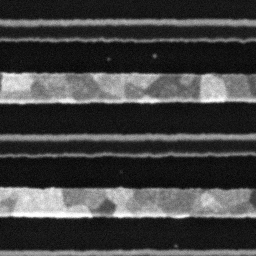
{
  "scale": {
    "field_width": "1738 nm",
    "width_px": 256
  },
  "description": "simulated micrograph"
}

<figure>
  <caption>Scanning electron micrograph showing lines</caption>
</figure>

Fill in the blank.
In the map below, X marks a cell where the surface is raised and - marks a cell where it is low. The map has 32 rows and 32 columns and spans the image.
--------------------------------
--------------------------------
--------------------------------
XXXXXXXXXXXXXXXXXXXXXXXXXXXXXXXX
XXXXXXXXXXXXXXXXXXXXXXXXXXXXXXXX
--------------------------------
--------------------------------
--------------------------------
--------------------------------
XXXXXXXXXXXXXXXXXXXXXXXXXXXXXXXX
XXXXXXXXXXXXXXXXXXXXXXXXXXXXXXXX
XXXXXXXXXXXXXXXXXXXXXXXXXXXXXXXX
XXXXXXXXXXXXXXXXXXXXXXXXXXXXXXXX
--------------------------------
--------------------------------
--------------------------------
--------------------------------
XXXXXXXXXXXXXXXXXXXXXXXXXXXXXXXX
XXXXXXXXXXXXXXXXXXXXXXXXXXXXXXXX
XXXXX-X----X----XXXXX-----------
--------------------------------
--------------------------------
--------------------------------
--------------------------------
XXXXXXXXXXXXXXXXXXXXXXXXXXXXXXXX
XXXXXXXXXXXXXXXXXXXXXXXXXXXXXXXX
XXXXXXXXXXXXXXXXXXXXXXXXXXXXXXXX
--------------------------------
--------------------------------
--------------------------------
--------------------------------
------------------X-------------